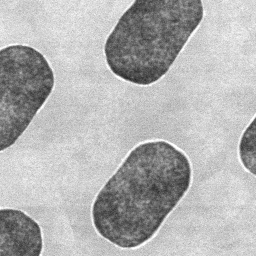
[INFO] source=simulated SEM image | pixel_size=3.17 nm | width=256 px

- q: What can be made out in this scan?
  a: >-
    holes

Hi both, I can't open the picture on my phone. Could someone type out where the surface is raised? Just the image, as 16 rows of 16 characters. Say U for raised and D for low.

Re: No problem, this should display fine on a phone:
UUUUUUUUDDDDDUUU
UUUUUUUDDDDDUUUU
UUUUUUUDDDDDUUUU
DDDUUUUDDDDUUUUU
DDDUUUUDDDUUUUUU
DDDUUUUUUUUUUUUU
DDDUUUUUUUUUUUUU
DDUUUUUUUUUUUUUU
DUUUUUUUUUUUUUUD
UUUUUUUUDDDUUUUD
UUUUUUUDDDDDUUUD
UUUUUUUDDDDDUUUU
UUUUUUDDDDDUUUUU
DDUUUUDDDDUUUUUU
DDDUUUDDDDUUUUUU
DDDUUUUUUUUUUUUU